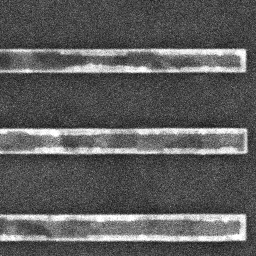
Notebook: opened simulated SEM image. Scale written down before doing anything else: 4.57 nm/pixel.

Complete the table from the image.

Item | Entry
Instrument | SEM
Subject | one or a few lines or trenches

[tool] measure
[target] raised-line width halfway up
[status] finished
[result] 108 nanometers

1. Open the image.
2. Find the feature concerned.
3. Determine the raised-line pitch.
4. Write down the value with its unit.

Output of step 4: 381 nm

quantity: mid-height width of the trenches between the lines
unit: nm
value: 273